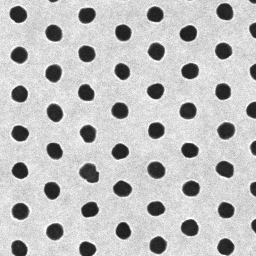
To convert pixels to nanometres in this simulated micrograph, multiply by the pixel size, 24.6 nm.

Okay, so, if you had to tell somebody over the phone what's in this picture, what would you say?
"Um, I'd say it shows a regular array of holes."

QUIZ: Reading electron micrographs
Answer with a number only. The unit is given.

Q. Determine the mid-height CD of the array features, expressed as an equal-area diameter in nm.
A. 412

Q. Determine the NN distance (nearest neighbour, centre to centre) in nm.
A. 925